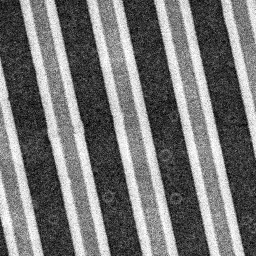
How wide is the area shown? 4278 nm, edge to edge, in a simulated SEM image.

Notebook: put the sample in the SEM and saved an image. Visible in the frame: one or a few lines or trenches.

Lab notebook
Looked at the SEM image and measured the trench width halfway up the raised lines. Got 708 nm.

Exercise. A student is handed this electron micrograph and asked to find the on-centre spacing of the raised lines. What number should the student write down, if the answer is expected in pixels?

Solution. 65.5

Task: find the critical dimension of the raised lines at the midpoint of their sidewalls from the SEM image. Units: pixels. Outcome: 22.9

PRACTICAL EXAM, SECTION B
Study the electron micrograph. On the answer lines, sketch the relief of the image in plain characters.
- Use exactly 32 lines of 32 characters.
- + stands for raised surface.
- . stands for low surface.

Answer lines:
...+++......+++.....+++.....+++.
...+++......+++.....+++......+++
....+++.....+++.....++++.....+++
....+++.....+++......+++.....+++
....+++.....++++.....+++.....+++
....+++......+++.....+++.....+++
.....+++.....+++.....+++......++
.....+++.....+++......+++.....++
.....+++.....+++......+++.....++
.....+++......+++.....+++.....++
.....+++......+++.....+++......+
......+++.....+++.....+++......+
......+++.....+++......+++.....+
+.....+++.....++++.....+++.....+
+.....+++......+++.....+++.....+
+......+++.....+++.....+++......
+......+++.....+++......+++.....
++.....+++.....+++......+++.....
++.....+++......+++.....+++.....
++.....+++......+++.....+++.....
++......+++.....+++.....+++.....
++......+++.....+++......+++....
+++.....+++.....++++.....+++....
+++.....+++......+++.....+++....
+++.....++++.....+++.....+++....
+++......+++.....+++......+++...
.+++.....+++.....+++......+++...
.+++.....+++......+++.....+++...
.+++.....+++......+++.....+++...
.+++......+++.....+++.....+++...
.+++......+++.....+++......+++..
..+++.....+++.....++++.....+++..